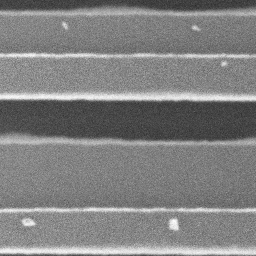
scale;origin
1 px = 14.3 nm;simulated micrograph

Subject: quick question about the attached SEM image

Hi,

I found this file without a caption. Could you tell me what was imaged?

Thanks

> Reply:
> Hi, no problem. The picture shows lines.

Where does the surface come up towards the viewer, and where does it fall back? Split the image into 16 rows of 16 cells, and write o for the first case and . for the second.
................
oooooooooooooooo
oooooooooooooooo
oooooooooooooooo
oooooooooooooooo
oooooooooooooooo
................
................
................
oooooooooooooooo
oooooooooooooooo
oooooooooooooooo
oooooooooooooooo
oooooooooooooooo
oooooooooooooooo
oooooooooooooooo